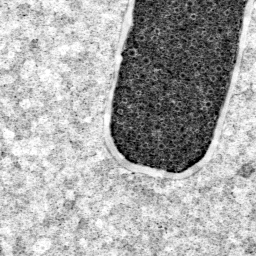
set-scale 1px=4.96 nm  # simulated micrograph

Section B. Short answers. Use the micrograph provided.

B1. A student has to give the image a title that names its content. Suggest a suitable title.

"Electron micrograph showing one or a few lines or trenches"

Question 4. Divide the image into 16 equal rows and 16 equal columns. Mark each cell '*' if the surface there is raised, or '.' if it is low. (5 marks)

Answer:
********.......*
********.......*
********.......*
*******........*
*******........*
*******.......**
*******.......**
*******.......**
*******......***
*******......***
*********...****
****************
****************
****************
****************
****************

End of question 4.